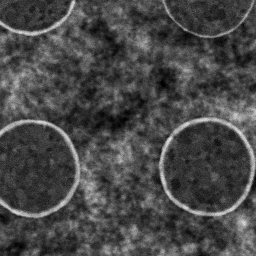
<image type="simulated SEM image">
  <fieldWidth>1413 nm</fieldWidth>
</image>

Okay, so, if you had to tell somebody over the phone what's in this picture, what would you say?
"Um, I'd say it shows raised bodies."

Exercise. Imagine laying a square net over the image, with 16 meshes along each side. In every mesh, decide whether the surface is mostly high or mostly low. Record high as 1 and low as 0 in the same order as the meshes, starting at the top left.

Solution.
1111000000000000
1111000000000000
0000000000000000
0000000000000000
0000000000000000
0000000000000000
0000000000000000
0000000000000100
1111000000011110
1111100000111111
1111100000111111
1111100000111111
1111000000011110
0000000000000000
0000000000000000
0000000000000000